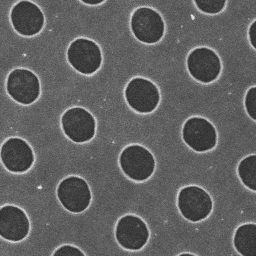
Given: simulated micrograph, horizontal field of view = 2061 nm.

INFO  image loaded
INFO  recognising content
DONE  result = a regular array of holes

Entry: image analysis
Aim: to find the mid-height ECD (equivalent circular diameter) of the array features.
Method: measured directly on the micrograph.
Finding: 279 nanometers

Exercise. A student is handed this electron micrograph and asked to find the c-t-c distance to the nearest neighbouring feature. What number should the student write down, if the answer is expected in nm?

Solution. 551